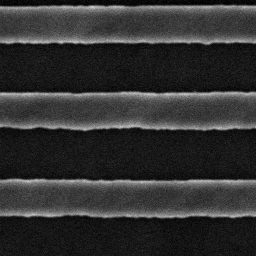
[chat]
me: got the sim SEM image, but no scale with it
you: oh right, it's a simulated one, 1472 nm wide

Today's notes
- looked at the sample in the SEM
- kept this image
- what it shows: lines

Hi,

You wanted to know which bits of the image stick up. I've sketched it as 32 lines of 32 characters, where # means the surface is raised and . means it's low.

................................
################################
################################
################################
################################
................................
................................
................................
................................
................................
................................
................................
################################
################################
################################
################################
................................
................................
................................
................................
................................
................................
.##.##....#.....................
################################
################################
################################
################################
................................
................................
................................
................................
................................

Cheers